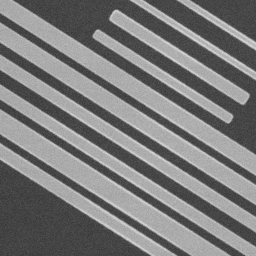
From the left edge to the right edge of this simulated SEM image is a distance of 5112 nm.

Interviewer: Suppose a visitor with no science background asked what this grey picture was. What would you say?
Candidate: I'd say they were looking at groups of lines, slits or small figures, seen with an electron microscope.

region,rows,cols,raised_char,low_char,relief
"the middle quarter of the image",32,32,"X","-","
X----XXXXXXXX-----XXXXX-------XX
XXX----XXXXXXX------XXXX-------X
XXXX----XXXXXXXX------XXXX------
XXXXXX----XXXXXXXX-----XXXX-----
XXXXXXX----XXXXXXXX------XXXX---
-XXXXXXXX----XXXXXXXX------XXXX-
---XXXXXXX----XXXXXXXX------XXXX
-----XXXXXXX----XXXXXXXX------XX
X-----XXXXXXXX----XXXXXXX------X
XX------XXXXXXX----XXXXXXXX-----
XXXX-----XXXXXXXX----XXXXXXX----
XXXXXX-----XXXXXXX----XXXXXXXX--
--XXXXX-----XXXXXXXX----XXXXXXX-
---XXXXXX-----XXXXXXX-----XXXXXX
-----XXXXX-----XXXXXXXX----XXXXX
------XXXXXX-----XXXXXXX-----XXX
XX------XXXXX------XXXXXXX----XX
XXX-------XXXXX-----XXXXXXX-----
XXXXX------XXXXXX-----XXXXXXX---
-XXXXX-------XXXXX------XXXXXXX-
---XXXXX------XXXXXX-----XXXXXXX
----XXXXX-------XXXXX------XXXXX
X-----XXXXX-------XXXXX-----XXXX
XXX----XXXXXX------XXXXX------XX
XXXX-----XXXXX-------XXXXX-----X
XXXXXX-----XXXXX------XXXXX-----
XXXXXXXX----XXXXX-------XXXXX---
XXXXXXXXX-----XXXXX------XXXXXX-
-XXXXXXXXXX----XXXXX-------XXXXX
---XXXXXXXXX-----XXXXX------XXXX
X----XXXXXXXXX----XXXXXX------XX
XX----XXXXXXXXX-----XXXXX------X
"